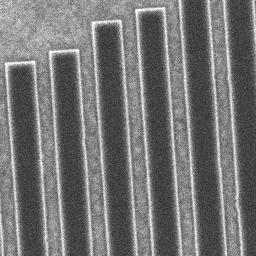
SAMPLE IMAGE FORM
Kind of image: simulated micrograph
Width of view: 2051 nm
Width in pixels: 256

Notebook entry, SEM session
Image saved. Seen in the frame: parallel lines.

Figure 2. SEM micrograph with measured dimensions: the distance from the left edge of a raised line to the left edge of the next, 0.353 microns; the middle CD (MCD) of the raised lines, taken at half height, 236 nm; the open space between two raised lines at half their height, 125 nm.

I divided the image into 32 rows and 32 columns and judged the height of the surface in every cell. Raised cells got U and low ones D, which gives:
DDDDDDDDDDDDDDDDDDDDDDUUUUDDUUUU
DDDDDDDDDDDDDDDDDUUUUDDUUUDDUUUU
DDDDDDDDDDDDDDDDDUUUUDDUUUDDUUUU
DDDDDDDDDDDDUUUDDUUUUDDUUUDDUUUU
DDDDDDDDDDDDUUUDDUUUUDDUUUDDUUUU
DDDDDDDDDDDDUUUDDUUUUDDUUUUDUUUU
DDDDDDDUUUDDUUUDDUUUUDDUUUUDUUUU
DDDDDDUUUUDDUUUDDUUUUDDUUUUDUUUU
DUUUDDUUUUDDUUUUDUUUUDDUUUUDDUUU
DUUUDDUUUUDDUUUUDDUUUDDUUUUDDUUU
DUUUUDDUUUDDUUUUDDUUUDDUUUUDDUUU
DUUUUDDUUUDDUUUUDDUUUDDUUUUDDUUU
DUUUUDDUUUDDUUUUDDUUUDDUUUUDDUUU
DUUUUDDUUUDDUUUUDDUUUDDUUUUDDUUU
DUUUUDDUUUDDUUUUDDUUUUDUUUUDDUUU
DUUUUDDUUUDDUUUUDDUUUUDUUUUDDUUU
DUUUUDDUUUDDUUUUDDUUUUDDUUUDDUUU
DUUUUDDUUUUDDUUUDDUUUUDDUUUDDUUU
DUUUUDDUUUUDDUUUDDUUUUDDUUUDDUUU
DDUUUDDUUUUDDUUUDDUUUUDDUUUDDUUU
DDUUUDDUUUUDDUUUDDUUUUDDUUUDDUUU
DDUUUDDUUUUDDUUUDDUUUUDDUUUUDUUU
DDUUUDDUUUUDDUUUUDDUUUDDUUUUDDUU
DDUUUDDUUUUDDUUUUDDUUUDDUUUUDDUU
DDUUUUDUUUUDDUUUUDDUUUDDUUUUDDUU
DDUUUUDUUUUDDUUUUDDUUUDDUUUUDDUU
DDUUUUDDUUUDDUUUUDDUUUDDUUUUDDUU
DDUUUUDDUUUDDUUUUDDUUUDDUUUUDDUU
DDUUUUDDUUUDDUUUUDDUUUDDUUUUDDUU
DDUUUUDDUUUDDUUUUDDUUUUDUUUUDDUU
DDUUUUDDUUUDDUUUUDDUUUUDDUUUDDUU
DDUUUUDDUUUUDDUUUDDUUUUDDUUUDDUU